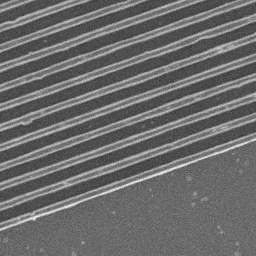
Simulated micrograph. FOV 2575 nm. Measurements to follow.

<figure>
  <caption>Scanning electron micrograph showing parallel lines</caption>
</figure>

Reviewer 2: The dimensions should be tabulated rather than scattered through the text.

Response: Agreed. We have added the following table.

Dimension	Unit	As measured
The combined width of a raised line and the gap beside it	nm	188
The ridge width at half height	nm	64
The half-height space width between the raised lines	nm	127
